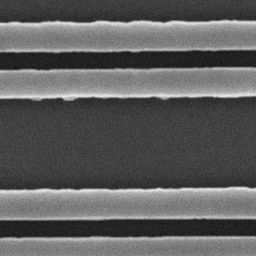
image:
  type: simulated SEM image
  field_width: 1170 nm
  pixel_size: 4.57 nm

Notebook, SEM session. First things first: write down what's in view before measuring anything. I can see lines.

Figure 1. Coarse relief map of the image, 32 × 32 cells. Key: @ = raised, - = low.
--------------------------------
--------------------------------
--------------------------------
@@@@@@@@@@@@@@@@@@@@@@@@@@@@@@@@
@@@@@@@@@@@@@@@@@@@@@@@@@@@@@@@@
@@@@@@@@@@@@@@@@@@@@@@@@@@@@@@@@
--------------------------------
--------------------------------
--------------------------@@@@@@
@@@@@@@@@@@@@@@@@@@@@@@@@@@@@@@@
@@@@@@@@@@@@@@@@@@@@@@@@@@@@@@@@
@@@@@@@@@@@@@@@@@@@@@@@@@@@@@@@@
--------------------------------
--------------------------------
--------------------------------
--------------------------------
--------------------------------
--------------------------------
--------------------------------
--------------------------------
--------------------------------
--------------------------------
--------------------------------
----------------------------@@@-
@@@@@@@@@@@@@@@@@@@@@@@@@@@@@@@@
@@@@@@@@@@@@@@@@@@@@@@@@@@@@@@@@
@@@@@@@@@@@@@@@@@@@@@@@@@@@@@@@@
--------------------------------
--------------------------------
--------------------------------
@@@@@@@@@@@@@@@@@@@@@@@@@@@@@@@@
@@@@@@@@@@@@@@@@@@@@@@@@@@@@@@@@